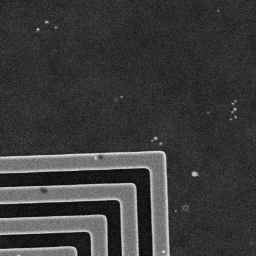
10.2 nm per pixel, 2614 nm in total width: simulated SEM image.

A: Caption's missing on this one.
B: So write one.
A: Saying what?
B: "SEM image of groups of lines, slits or small figures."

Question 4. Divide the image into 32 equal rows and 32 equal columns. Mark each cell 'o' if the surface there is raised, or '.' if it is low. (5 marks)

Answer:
................................
................................
................................
................................
................................
................................
................................
................................
................................
................................
................................
................................
................................
................................
................................
................................
................................
................................
................................
....ooooooooooooooooo...........
ooooooooooooooooooooo...........
oooo...............oo...........
...................oo...........
ooooooooooooooooo..oo...........
ooooooooooooooooo..oo...........
...............oo..oo...........
...............oo..oo...........
ooooooooooooo..oo..oo...........
ooooooooooooo..oo..oo...........
...........oo..oo..oo...........
...........oo..oo..oo...........
oooooooooo..o..oo..oo...........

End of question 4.